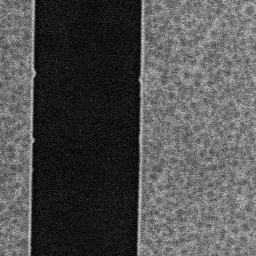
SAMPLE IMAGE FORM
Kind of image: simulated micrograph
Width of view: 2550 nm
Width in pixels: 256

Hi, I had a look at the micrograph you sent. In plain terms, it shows one or a few lines or trenches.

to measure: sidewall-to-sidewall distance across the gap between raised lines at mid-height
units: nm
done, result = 1090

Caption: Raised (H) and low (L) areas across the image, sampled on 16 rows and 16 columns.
HHLLLLLLLHHHHHHH
HHLLLLLLLHHHHHHH
HHLLLLLLLHHHHHHH
HHLLLLLLLHHHHHHH
HHLLLLLLLHHHHHHH
HHLLLLLLLHHHHHHH
HHLLLLLLLHHHHHHH
HHLLLLLLLHHHHHHH
HHLLLLLLLHHHHHHH
HHLLLLLLLHHHHHHH
HHLLLLLLLHHHHHHH
HHLLLLLLLHHHHHHH
HHLLLLLLLHHHHHHH
HHLLLLLLLHHHHHHH
HHLLLLLLLHHHHHHH
HHLLLLLLLHHHHHHH